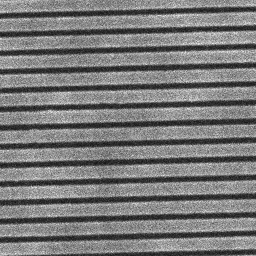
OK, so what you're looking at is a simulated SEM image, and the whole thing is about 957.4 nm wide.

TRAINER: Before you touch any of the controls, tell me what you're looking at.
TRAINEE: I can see parallel lines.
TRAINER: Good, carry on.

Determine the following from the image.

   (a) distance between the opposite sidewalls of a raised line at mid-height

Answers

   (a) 0.0444 microns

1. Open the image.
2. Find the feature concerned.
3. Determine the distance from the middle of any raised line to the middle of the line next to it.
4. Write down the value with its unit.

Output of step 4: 69.9 nm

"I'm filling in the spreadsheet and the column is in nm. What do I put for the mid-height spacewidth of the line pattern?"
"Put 23.8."